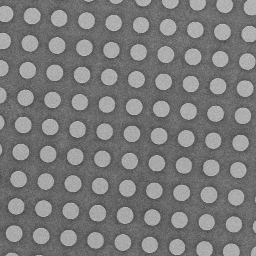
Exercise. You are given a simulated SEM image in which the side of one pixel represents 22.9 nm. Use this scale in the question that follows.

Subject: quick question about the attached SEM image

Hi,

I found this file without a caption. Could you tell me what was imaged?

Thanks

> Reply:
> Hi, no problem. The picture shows an array of small figures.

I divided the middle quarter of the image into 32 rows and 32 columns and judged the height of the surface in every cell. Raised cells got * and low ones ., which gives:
................................
...***.....*....................
...***...****....***............
...***...****...****...****...**
....*.....***...****...****...**
.................**....****...**
..............................**
................................
..****....**....................
..****...****...***....**.......
..****...****...****..****....**
.........***....***...****...***
.................**....***...***
..............................**
...*............................
..***....***....................
.****...****...****....**.......
..***...****...****...****...***
.........**....****...****...***
......................***....***
..............................*.
..**............................
.****...***.....*...............
.****...***....***....***.....*.
.***....***....***...****...****
.........*.....***...****...****
......................**....****
................................
.***............................
****...****....**...............
****...****...****...***....**..
.***...****...****...***....***.